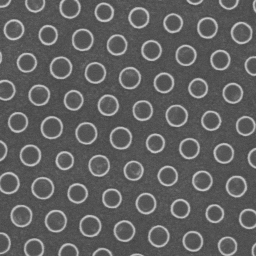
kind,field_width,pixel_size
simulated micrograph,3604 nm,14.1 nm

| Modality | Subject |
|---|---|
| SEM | a regular array of raised bodies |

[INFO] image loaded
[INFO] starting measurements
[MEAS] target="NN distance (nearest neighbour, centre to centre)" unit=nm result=488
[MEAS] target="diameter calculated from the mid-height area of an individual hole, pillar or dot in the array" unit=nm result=271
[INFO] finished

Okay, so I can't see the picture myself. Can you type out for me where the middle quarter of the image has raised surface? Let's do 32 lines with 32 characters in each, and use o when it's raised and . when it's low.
oo....oooo......................
oo....oooo.....ooo..............
o....ooooo....ooooo.....oo......
......oooo....ooooo....oooo.....
.......oo.....ooooo....oooo.....
...............ooo.....oooo....o
.......................oooo....o
.ooo............................
ooooo.....ooo...................
oooo.....oooo......oo...........
.ooo.....oooo.....oooo.....oo...
.........oooo....ooooo....oooo..
..........oo.....ooooo....ooooo.
..................ooo.....ooooo.
..........................oooo..
....oooo....................o...
...ooooo.....ooo................
...ooooo....ooooo...............
...ooooo....ooooo....oooo.......
....ooo.....ooooo....oooo.....oo
.............ooo.....oooo....ooo
.....................ooo.....ooo
o............................ooo
oo.....ooo......................
oo....ooooo......o..............
oo....ooooo....oooo.............
.......oooo....ooooo....oooo....
.......ooo.....oooo.....oooo....
................ooo.....oooo....
........................oooo....
..ooo...........................
.ooooo.....o....................